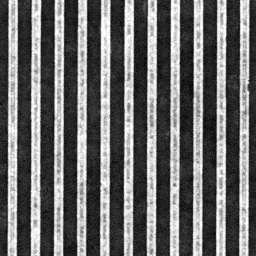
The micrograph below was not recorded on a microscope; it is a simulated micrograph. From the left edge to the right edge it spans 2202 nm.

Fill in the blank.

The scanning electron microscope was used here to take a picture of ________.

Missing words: parallel lines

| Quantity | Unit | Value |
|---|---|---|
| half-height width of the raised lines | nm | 52.7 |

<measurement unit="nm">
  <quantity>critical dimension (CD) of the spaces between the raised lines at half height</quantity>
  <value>143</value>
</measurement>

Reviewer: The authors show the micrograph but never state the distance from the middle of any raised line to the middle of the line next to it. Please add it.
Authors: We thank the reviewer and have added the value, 199 nm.